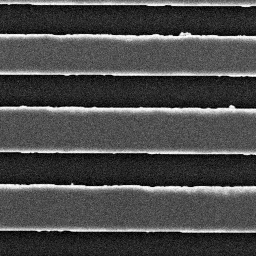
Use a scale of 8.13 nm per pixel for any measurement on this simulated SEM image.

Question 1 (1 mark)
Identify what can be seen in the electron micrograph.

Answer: lines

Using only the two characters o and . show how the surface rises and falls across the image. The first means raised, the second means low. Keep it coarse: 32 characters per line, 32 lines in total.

....oooooooooooooooooooooooooooo
................................
................................
................................
ooooooooooooooo....o...oo.......
oooooooooooooooooooooooooooooooo
oooooooooooooooooooooooooooooooo
oooooooooooooooooooooooooooooooo
oooooooooooooooooooooooooooooooo
................................
................................
................................
................................
ooooooo.........................
oooooooooooooooooooooooooooooooo
oooooooooooooooooooooooooooooooo
oooooooooooooooooooooooooooooooo
oooooooooooooooooooooooooooooooo
oooooooooooooooooooooooooooooooo
................................
................................
................................
................................
oooooooooooooooooooooooooo....oo
oooooooooooooooooooooooooooooooo
oooooooooooooooooooooooooooooooo
oooooooooooooooooooooooooooooooo
oooooooooooooooooooooooooooooooo
oooooooooooooooooooooooooooooooo
................................
................................
................................